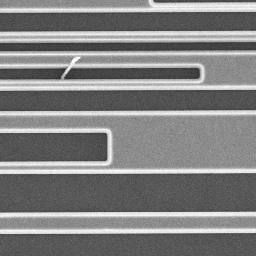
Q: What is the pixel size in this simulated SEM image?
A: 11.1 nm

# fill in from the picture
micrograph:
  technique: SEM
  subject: groups of lines, slits or small figures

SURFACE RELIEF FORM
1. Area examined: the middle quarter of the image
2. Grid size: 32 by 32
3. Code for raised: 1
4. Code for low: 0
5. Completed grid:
11111111111111111111111111111111
10000000000000000000000000000000
00000000000000000000000000000000
00000000000000000000000000000000
11111111111111111111111111111111
11111111111111111111111111111111
00000000000000000000000000000000
00000000000000000000000000000000
00000000000000000000000000000000
00000000000000000000000000000000
00000000000000000000000000000000
00000000000000000000000000000000
11111111111111111111111111111111
11111111111111111111111111111111
11111111111111111111111111111111
11111111111111111111111111111111
11111111111111111111111111111111
00000000000111111111111111111111
00000000000111111111111111111111
00000000000111111111111111111111
00000000000111111111111111111111
00000000000111111111111111111111
00000000000111111111111111111111
00000000000111111111111111111111
00000000000111111111111111111111
11111111111111111111111111111111
11111111111111111111111111111111
00000000000000000000000000000000
00000000000000000000000000000000
00000000000000000000000000000000
00000000000000000000000000000000
00000000000000000000000000000000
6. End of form